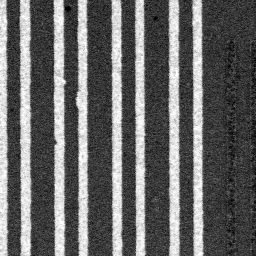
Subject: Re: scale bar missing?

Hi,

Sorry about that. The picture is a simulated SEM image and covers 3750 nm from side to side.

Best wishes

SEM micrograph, parallel lines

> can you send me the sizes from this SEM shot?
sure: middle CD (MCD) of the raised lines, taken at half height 121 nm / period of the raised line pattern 426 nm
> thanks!